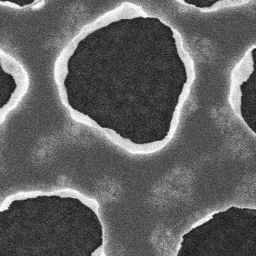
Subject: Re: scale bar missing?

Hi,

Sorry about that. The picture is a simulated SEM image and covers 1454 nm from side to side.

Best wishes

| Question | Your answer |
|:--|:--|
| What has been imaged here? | holes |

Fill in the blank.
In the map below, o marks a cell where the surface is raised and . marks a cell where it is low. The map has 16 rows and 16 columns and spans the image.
oooooooooooo.ooo
oooooo....oooooo
ooooo......ooooo
oooo........oooo
.ooo........ooo.
.ooo........ooo.
.ooo.......oooo.
ooooo......oooo.
ooooooo...oooooo
oooooooooooooooo
oooooooooooooooo
oooooooooooooooo
o....ooooooooooo
......ooooooo...
......oooooo....
......ooooo.....